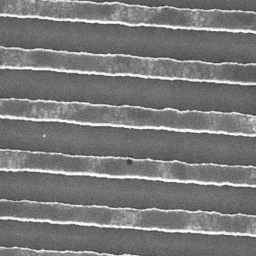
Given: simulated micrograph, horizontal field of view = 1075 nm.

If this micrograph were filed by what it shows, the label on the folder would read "lines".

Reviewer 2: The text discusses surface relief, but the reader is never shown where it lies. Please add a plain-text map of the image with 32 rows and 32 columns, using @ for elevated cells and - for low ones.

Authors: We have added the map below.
@@@@@@@@@@@@@@@@----------------
@@@@@@@@@@@@@@@@@@@@@@@@@@@@@@@@
-------@@@@@@@@@@@@@@@@@@@@@@@@@
------------------------@@@@@@@@
--------------------------------
--------------------------------
@@@@@@@@@-----------------------
@@@@@@@@@@@@@@@@@@@@@@----------
--@-@@@@@@@@@@@@@@@@@@@@@@@@@@@@
-----------------@@@@@@@@@@@@@@@
--------------------------------
--------------------------------
@@@-----------------------------
@@@@@@@@@@@@@@@@@@--------------
@@@@@@@@@@@@@@@@@@@@@@@@@@@@@@@@
-----------@@@@@@@@@@@@@@@@@@@@@
--------------------------@@@@@@
--------------------------------
--------------------------------
@@@@@@@@@-----------------------
@@@@@@@@@@@@@@@@@@@@@@@@-@@-----
-------@@@@@@@@@@@@@@@@@@@@@@@@@
--------------------@@@@@@@@@@@@
--------------------------------
--------------------------------
@@@@@@@@------------------------
@@@@@@@@@@@@@@@@@@@@@@@@@-------
---@@@@@@@@@@@@@@@@@@@@@@@@@@@@@
-----------------@@@@@@@@@@@@@@@
--------------------------------
--------------------------------
@@@@@@@@@-----------------------